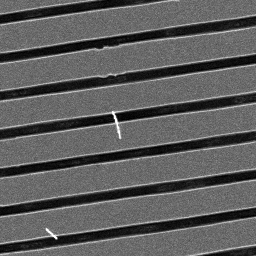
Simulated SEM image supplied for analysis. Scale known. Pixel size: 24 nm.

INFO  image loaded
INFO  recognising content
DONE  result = parallel lines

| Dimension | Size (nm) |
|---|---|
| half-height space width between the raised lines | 235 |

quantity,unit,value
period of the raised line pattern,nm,912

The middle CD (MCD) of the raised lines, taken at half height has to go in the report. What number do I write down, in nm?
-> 681